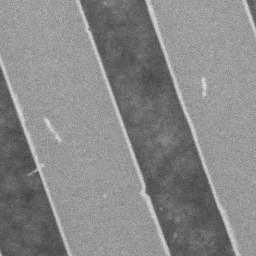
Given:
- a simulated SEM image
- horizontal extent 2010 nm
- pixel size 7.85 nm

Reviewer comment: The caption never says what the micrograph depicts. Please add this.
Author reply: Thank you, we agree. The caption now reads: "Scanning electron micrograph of one or a few lines or trenches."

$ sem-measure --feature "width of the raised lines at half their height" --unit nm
734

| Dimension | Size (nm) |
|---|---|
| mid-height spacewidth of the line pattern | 500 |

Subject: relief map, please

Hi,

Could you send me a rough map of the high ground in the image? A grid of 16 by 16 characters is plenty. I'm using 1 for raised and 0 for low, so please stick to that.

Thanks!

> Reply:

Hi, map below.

1111100001111110
1111100000111111
1111110000111111
1111110000111111
1111111000011111
0111111000011111
0111111000011111
0111111100001111
0011111100001111
0011111100001111
0011111110000111
0001111110000111
0001111110000011
0000111111000011
0000111111000011
0000111111000001